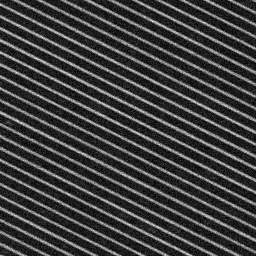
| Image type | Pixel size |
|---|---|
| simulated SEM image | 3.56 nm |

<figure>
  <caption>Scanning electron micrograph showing parallel lines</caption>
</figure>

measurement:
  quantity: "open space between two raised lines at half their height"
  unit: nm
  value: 31.4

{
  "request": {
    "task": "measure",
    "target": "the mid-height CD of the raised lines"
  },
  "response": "1.99 px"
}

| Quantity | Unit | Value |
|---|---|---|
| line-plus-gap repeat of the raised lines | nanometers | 38.1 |